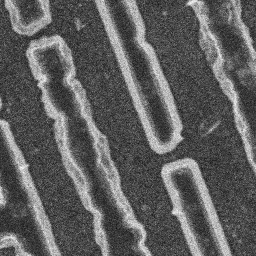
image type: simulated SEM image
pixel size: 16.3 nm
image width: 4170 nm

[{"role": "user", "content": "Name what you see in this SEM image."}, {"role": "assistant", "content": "one or a few lines or trenches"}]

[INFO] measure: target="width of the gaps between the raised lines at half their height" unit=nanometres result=831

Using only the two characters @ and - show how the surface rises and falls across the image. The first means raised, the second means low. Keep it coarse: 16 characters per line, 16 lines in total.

-@@---@@----@@@-
-@-----@@----@@-
-------@@----@@@
--@@----@-----@@
--@@----@@----@@
---@@---@@----@@
---@@----@@----@
----@@---@@----@
@---@@---@@----@
@---@@@---------
@----@@----@----
@@---@@----@@---
@@---@@@---@@---
@@@---@@---@@---
@@@---@@@---@@--
-@@---@@@---@@--